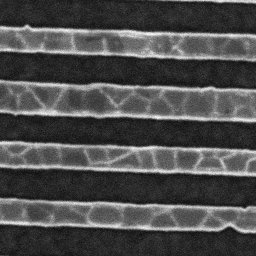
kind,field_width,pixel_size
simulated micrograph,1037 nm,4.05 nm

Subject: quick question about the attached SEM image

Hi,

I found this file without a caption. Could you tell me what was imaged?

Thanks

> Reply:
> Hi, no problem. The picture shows parallel lines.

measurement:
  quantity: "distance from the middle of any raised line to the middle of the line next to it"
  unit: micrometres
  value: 0.233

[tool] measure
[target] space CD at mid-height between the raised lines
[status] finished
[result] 128 nanometers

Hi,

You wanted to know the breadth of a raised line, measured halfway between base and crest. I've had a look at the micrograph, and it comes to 95.7 nm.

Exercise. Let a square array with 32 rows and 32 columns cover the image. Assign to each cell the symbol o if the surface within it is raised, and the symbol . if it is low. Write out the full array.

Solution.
................................
................................
................................
...o............................
oooooooooooooooooooooooooooooooo
oooooooooooooooooooooooooooooooo
........oooooooooooooooooooooooo
...............................o
................................
................................
ooooo...........................
oooooooooooooooooooooooooooooooo
oooooooooooooooooooooooooooooooo
oooooooooooooooooooooooooooooooo
............o....ooooooooooooooo
................................
................................
................................
oooooooooooooooo..oooo..........
oooooooooooooooooooooooooooooooo
oooooooooooooooooooooooooooooooo
....................oo.ooooooooo
................................
................................
................................
ooooooooooooooo.................
oooooooooooooooooooooooooooooooo
oooooooooooooooooooooooooooooooo
................oooooooooooo.ooo
................................
................................
................................